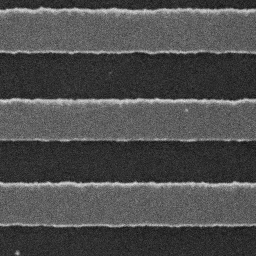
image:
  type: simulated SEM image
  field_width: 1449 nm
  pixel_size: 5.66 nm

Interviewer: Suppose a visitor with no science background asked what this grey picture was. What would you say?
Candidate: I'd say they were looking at lines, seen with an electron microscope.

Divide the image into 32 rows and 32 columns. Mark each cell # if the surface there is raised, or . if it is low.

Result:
................................
################################
################################
################################
################################
################################
#################.#######.######
................................
................................
................................
................................
................................
.##..............#.##.#.#.....##
################################
################################
################################
################################
.#...####.....##......###...####
................................
................................
................................
................................
................................
################################
################################
################################
################################
################################
................................
................................
................................
................................